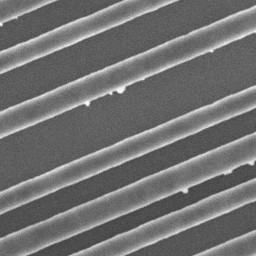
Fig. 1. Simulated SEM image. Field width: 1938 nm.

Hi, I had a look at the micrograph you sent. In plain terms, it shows lines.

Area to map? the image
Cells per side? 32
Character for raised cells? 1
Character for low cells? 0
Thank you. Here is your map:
11111100000000111111100000000000
11110000000011111110000000000011
10000000001111110000000000001111
00000001111111000000000001111111
00000111111000000000000111111110
00111111100000000000111111110000
11111110000000000011111111000000
11110000000000001111111100000000
11000000000001111111100000000000
00000000000111111110000000000000
00000000111111110000000000000000
00000011111111000000000000000011
00001111111100000000000000001111
01111111100000000000000001111111
11111110000000000000000111111000
11110000000000000000111111100000
11000000000000000011111110000000
00000000000000011111110000000011
00000000000001111111000000011111
00000000000111111100000001111111
00000000111111100000001111111110
00000011111110000000111111110000
00001111110000000011111111000001
01111111000000011111111000000111
11111000000001111111100000111111
11100000001111111110000011111110
10000000111111110000001111110000
00000011111111000001111111000000
00011111111000000111111100000000
01111111100000011111100000000011
11111110000011111110000000001111
11110000001111110000000001111111